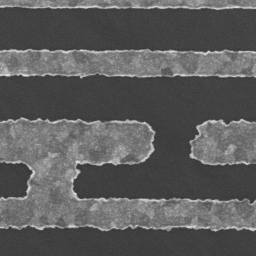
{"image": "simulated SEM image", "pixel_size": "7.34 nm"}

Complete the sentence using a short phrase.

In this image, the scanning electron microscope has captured one or a few lines or trenches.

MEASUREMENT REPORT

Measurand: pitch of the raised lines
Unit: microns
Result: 0.55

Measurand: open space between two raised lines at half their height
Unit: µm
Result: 0.323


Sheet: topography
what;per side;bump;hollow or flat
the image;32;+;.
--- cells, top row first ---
++++++++++++++++++++++++++++++++
................................
................................
................................
................................
................................
++++++++++++++++++++...+....+++.
++++++++++++++++++++++++++++++++
++++++++++++++++++++++++++++++++
..........+......+.+++...+...+.+
................................
................................
................................
................................
................................
++++++++++++++++++.......+++.+++
+++++++++++++++++++......+++++++
+++++++++++++++++++.....++++++++
+++++++++++++++++++.....++++++++
++++++++++++++++++......++++++++
...+++++++................+.+...
....++++++......................
....+++++.......................
....+++++.......................
...+++++++......................
++++++++++++++++++++++++++++++++
++++++++++++++++++++++++++++++++
++++++++++++++++++++++++++++++++
+.+.........++.+...++.....+++.++
................................
................................
................................